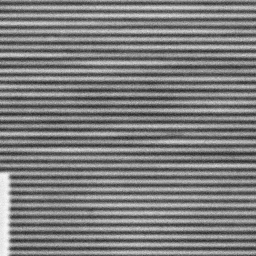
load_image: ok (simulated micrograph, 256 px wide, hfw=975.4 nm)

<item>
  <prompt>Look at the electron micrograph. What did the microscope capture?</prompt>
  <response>parallel lines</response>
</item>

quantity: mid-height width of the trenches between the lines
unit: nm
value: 16.7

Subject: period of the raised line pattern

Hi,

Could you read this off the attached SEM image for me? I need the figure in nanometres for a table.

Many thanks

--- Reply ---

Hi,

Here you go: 30.1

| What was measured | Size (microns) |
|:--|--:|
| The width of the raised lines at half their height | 0.0133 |